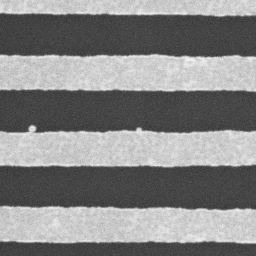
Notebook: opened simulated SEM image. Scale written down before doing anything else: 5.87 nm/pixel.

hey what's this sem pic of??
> lines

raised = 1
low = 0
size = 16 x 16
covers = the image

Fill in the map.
1111111111111111
0000000000000000
0000000000000000
0000000001000000
1111111111111111
1111111111111111
0000000000000000
0000000000000000
1111111111111111
1111111111111111
0000000000000000
0000000000000000
0000000000000000
1111111111111111
1111111111111111
0000000000000000